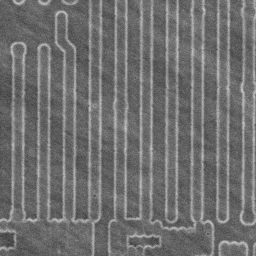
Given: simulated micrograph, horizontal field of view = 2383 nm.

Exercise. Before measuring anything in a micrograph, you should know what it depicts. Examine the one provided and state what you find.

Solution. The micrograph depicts wiring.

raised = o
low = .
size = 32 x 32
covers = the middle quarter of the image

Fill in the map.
ooo....oo....oo....ooo....oo....
ooo....oo....oo....ooo....oo....
ooo....oo....oo....ooo....oo....
ooo....oo....oo....ooo....oo....
ooo....oo....oo....ooo....oo....
ooo....oo....oo....ooo....oo....
ooo....oo....oo....ooo....oo....
ooo...ooo....oo....ooo....oo....
ooo...ooo....oo....ooo....oo....
ooo...ooo....ooo...ooo....oo....
ooo...ooo....ooo...ooo....oo....
ooo...ooo....oo....ooo....oo....
ooo...ooo....oo....ooo....oo....
ooo...ooo....oo....ooo....oo....
ooo...ooo....oo....ooo....oo....
ooo...ooo....oo....ooo....oo....
ooo...ooo....oo....ooo....oo....
ooo...ooo....oo....ooo....oo....
ooo...ooo....oo....ooo....oo....
ooo...ooo....oo....ooo....oo....
ooo...ooo....oo....ooo....oo....
ooo...ooo....oo....ooo....oo....
ooo...ooo....oo....ooo....oo....
ooo...ooo....oo....ooo....oo....
ooo...ooo....oo....ooo....oo....
ooo...ooo....oo....ooo....oo....
ooo...ooo....oo....ooo....oo....
ooo...ooo....oo....ooo....oo....
ooo...ooo....oo....ooo....oo....
ooo...ooo....oo....ooo....oo....
ooo...ooo....oo....ooo....oo....
ooo...ooo....oo....ooo....oo....